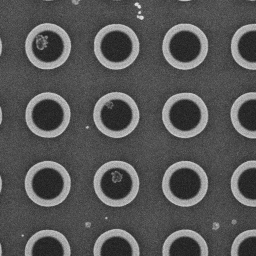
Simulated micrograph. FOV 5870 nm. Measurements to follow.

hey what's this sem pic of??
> an array of small figures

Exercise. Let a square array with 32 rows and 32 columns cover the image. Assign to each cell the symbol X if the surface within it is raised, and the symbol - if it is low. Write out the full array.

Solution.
--------------------------------
--------------------------------
--------------------------------
----XXXX-----XXX------XXX-----XX
---XXXXXX---XXXXX----XXXXX---XXX
---XXXXXX---XXXXX---XXXXXX---XXX
---XXXXXX---XXXXX---XXXXXX---XXX
----XXXX----XXXXX----XXXX----XXX
-----XX-------X-------XX-------X
--------------------------------
--------------------------------
--------------------------------
----XXXX----XXXXX----XXXX-----XX
---XXXXXX---XXXXX---XXXXXX---XXX
---XXXXXX---XXXXX---XXXXXX---XXX
---XXXXXX---XXXXX----XXXXX---XXX
----XXXX-----XXX-----XXXX-----XX
--------------------------------
--------------------------------
--------------------------------
-----XX------XXX------XX------XX
----XXXX----XXXXX----XXXXX---XXX
---XXXXXX---XXXXX---XXXXXX---XXX
---XXXXXX---XXXXX---XXXXXX---XXX
----XXXX----XXXXX----XXXXX---XXX
-----XX------XXX------XX------XX
--------------------------------
--------------------------------
--------------------------------
----XXXX-----XXX-----XXXX-----XX
---XXXXXX---XXXXX----XXXXX---XXX
---XXXXXX---XXXXX---XXXXXX---XXX